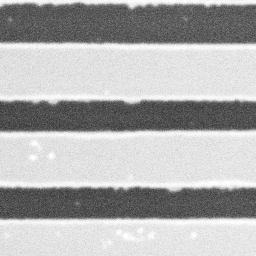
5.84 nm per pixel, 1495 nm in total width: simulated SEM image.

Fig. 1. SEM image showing lines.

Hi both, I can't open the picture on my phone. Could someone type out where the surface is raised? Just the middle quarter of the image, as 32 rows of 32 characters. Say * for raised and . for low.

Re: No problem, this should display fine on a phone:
********************************
********************************
********************************
********************************
********************************
********************************
********************************
********************************
********************************
................................
................................
................................
................................
................................
................................
................................
................................
********************************
********************************
********************************
********************************
********************************
********************************
********************************
********************************
********************************
********************************
********************************
********************************
********************************
****.*************.*************
................................